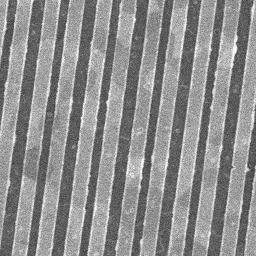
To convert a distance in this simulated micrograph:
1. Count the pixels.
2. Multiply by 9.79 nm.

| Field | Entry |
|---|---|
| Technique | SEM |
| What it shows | parallel lines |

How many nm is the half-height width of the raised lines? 147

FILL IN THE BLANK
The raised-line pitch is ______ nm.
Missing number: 253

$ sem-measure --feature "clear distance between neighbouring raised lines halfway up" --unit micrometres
0.104